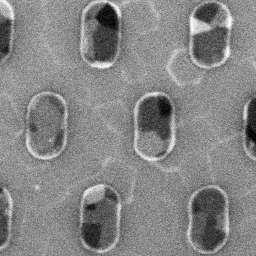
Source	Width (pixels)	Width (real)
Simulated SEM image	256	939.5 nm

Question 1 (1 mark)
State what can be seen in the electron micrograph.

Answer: raised bodies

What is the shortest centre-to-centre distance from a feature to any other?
107 pixels